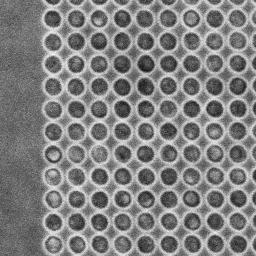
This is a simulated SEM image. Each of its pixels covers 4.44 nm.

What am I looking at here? a regular array of holes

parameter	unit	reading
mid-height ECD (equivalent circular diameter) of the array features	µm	0.0803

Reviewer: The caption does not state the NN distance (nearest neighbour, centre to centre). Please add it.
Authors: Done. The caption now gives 22.3 pixels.